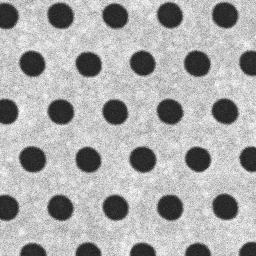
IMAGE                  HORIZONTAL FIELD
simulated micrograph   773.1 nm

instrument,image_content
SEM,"a regular array of holes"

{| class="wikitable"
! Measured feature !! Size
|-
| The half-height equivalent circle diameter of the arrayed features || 77.1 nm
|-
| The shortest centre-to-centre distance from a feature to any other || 165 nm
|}